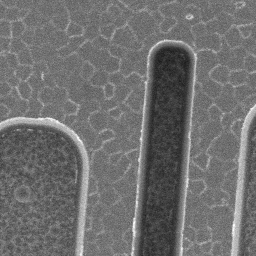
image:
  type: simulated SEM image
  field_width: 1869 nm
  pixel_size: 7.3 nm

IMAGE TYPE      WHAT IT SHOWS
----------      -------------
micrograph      one or a few lines or trenches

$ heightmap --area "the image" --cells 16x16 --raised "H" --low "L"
HHHHHHHHHHHHHHHH
HHHHHHHHHHHHHHHH
HHHHHHHHHHHHHHHH
HHHHHHHHHHLLHHHH
HHHHHHHHHLLLHHHH
HHHHHHHHHLLLHHHH
HHHHHHHHHLLLHHHH
HHHHHHHHHLLLHHHH
LLLLLHHHHLLLHHHL
LLLLLHHHHLLLHHHL
LLLLLHHHHLLLHHHL
LLLLLHHHHLLHHHHL
LLLLLHHHHLLHHHHL
LLLLLHHHHLLHHHHL
LLLLLHHHHLLHHHHL
LLLLLHHHLLLHHHHL